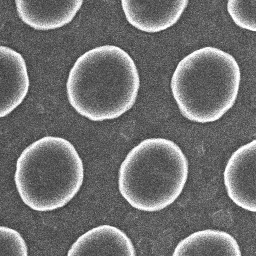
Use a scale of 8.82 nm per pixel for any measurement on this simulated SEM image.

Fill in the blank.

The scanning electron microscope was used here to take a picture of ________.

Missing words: raised bodies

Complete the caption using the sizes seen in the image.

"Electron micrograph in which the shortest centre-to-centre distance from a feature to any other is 914 nm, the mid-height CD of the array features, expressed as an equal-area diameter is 602 nm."